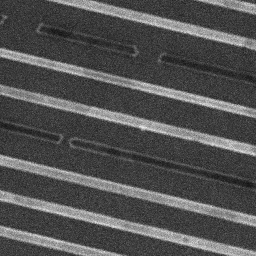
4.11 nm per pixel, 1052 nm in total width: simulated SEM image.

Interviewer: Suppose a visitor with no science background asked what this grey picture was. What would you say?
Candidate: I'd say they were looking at parallel lines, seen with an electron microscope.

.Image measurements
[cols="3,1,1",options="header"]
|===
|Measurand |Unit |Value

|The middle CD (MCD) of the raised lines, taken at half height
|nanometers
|33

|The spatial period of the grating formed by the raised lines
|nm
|141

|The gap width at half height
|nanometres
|107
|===